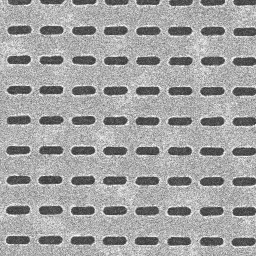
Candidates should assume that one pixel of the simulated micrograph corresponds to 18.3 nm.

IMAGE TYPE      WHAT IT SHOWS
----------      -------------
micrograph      a regular array of holes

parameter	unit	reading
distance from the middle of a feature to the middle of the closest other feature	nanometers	545